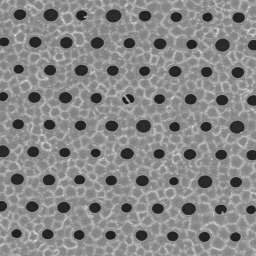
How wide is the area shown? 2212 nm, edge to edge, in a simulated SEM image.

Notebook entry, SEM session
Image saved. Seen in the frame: a regular array of holes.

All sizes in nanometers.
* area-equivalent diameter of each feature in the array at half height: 95.6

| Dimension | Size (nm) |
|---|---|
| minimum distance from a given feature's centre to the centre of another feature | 268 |